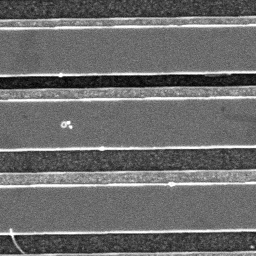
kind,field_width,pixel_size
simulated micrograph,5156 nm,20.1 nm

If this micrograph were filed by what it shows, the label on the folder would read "lines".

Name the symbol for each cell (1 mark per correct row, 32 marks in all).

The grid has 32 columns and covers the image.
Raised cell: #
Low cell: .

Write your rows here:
................................
................................
.......#########################
################################
################################
################################
################################
################################
################################
##.....#........................
................................
################################
################################
################################
################################
################################
################################
################################
#########################.......
................................
................................
...............#################
################################
################################
################################
################################
################################
################################
################################
................................
................................
................................